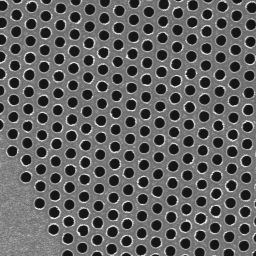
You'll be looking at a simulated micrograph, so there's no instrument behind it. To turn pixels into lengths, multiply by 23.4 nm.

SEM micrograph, a regular array of holes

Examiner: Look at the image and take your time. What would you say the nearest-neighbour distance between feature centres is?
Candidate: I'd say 390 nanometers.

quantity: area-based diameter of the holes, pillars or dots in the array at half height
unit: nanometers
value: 227